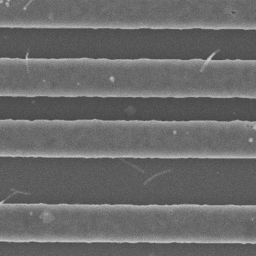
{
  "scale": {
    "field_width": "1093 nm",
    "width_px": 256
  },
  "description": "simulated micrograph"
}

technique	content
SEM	lines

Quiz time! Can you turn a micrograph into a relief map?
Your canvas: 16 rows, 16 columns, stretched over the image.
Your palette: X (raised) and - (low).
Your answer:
XXXXXXXXXXXXXXXX
XXXXXXXXXXXXXXXX
----------------
----------------
XXXXXXXXXXXXXXXX
XXXXXXXXXXXXXXXX
----------------
X----X----------
XXXXXXXXXXXXXXXX
XXXXXXXXXXXXXXXX
----------------
----------------
----------------
XXXXXXXXXXXXXXXX
XXXXXXXXXXXXXXXX
----------------